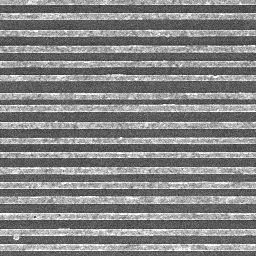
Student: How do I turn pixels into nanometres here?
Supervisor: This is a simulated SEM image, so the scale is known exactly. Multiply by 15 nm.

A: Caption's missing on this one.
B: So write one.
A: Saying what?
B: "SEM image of parallel lines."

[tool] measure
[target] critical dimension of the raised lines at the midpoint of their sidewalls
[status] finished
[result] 93.5 nm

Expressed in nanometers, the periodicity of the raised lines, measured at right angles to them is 231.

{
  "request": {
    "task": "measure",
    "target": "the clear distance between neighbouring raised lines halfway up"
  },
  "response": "129 nm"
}